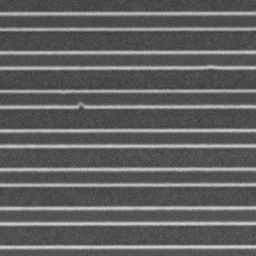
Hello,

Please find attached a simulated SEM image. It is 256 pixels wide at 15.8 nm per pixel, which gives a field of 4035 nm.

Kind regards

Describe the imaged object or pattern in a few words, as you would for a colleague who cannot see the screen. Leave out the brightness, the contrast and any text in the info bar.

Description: parallel lines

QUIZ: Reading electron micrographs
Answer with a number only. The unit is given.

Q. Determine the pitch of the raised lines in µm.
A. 0.613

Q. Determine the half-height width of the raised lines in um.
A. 0.256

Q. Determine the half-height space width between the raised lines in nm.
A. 351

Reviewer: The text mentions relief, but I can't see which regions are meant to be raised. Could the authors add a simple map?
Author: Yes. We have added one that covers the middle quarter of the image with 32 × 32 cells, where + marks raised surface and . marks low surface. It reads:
++++++++++++++++++++++++++++++++
................................
................................
................................
................................
................................
................................
++++++++++++++++++++++++++++++++
++++++++++++++++++++++++++++++++
++++++++++++++++++++++++++++++++
++++.+++++++++++++++++++++++++++
................................
................................
................................
................................
................................
................................
++++++++++++++++++++++++++++++++
++++++++++++++++++++++++++++++++
++++++++++++++++++++++++++++++++
................................
................................
................................
................................
................................
................................
.........+++++++++++++++++++++++
++++++++++++++++++++++++++++++++
++++++++++++++++++++++++++++++++
++++++++++++++++++++++++++++++++
................................
................................